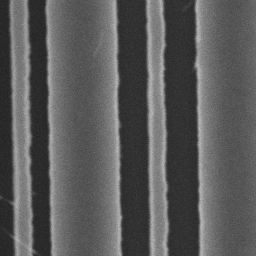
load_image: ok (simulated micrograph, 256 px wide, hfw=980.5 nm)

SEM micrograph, lines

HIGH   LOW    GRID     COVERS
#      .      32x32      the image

.##...#########...##....########
.##...#########...##....########
.##...#########...##.....#######
.##...#########...###....#######
.##...#########....##....#######
.###..#########....##....#######
.###..#########....#.....#######
..##..#########....#....########
..##..#########....#.....#######
..##..#########....#.....#######
..##..#########....#.....#######
..##..#########....#.....#######
..##..#########....#.....#######
..##..#########....##....#######
..##..#########....##....#######
..##..#########....##....#######
..##..#########....##....#######
..##..#########....##....#######
..##..#########....##....#######
..##..#########....##....#######
..##..#########....##....#######
..##..#########....##....#######
..##..#########....##....#######
..##..#########....##....#######
..##..#########....##....#######
..##..#########....##....#######
..##..#########....##....#######
..##..#########....##....#######
..##..#########....##....#######
..##..#########....##....#######
..##...########....##....#######
..##..#########....##....#######